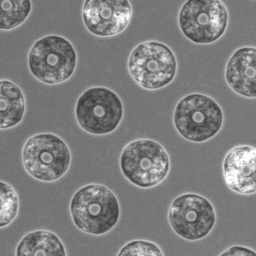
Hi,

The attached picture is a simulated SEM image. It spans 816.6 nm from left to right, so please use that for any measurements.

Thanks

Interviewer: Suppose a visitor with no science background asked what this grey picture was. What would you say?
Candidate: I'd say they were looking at a regular array of ring-shaped grooves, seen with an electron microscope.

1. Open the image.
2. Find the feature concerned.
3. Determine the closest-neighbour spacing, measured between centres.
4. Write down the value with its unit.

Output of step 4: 69.3 pixels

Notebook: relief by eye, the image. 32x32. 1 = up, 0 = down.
10001111111000001111111000001111
00001111110001001111111000001111
00011111111000001111110001001111
00111111111000011111111000001111
11111101111111111111111000001111
11110000011111111100111111111111
11110000011111111000011111111100
11110010011111110000001111111000
11110000011111110001001111110000
11110000011111111000001111110001
00111111111111111100011111111000
00011111111000111111111111111100
00011111110000011111111000011111
10011111110010011111110000011111
00011111110000011111110010001111
00111111110000011111110000001111
11111111111000111111110000011111
11110000111111111111111100111111
11100000111111110000111111111101
11100100011111100000011111110000
11100000011111100010011111110000
11110000111111100000011111110010
11111001111111110000111111110000
01111111110001111111111111111000
00111111100000111111111001111111
00111111100000011111110000111111
00111111100100011111100000011111
00111111100000011111100000011111
11111111110000111111110000111111
11100001111111111111111001111111
11000000111111110001111111111111
11000000111111100000111111110000